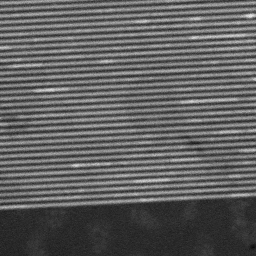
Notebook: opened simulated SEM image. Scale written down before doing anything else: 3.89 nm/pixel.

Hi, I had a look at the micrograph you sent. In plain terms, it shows parallel lines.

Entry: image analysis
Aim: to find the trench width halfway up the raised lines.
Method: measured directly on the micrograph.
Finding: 16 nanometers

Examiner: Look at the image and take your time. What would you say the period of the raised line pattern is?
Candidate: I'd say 6.38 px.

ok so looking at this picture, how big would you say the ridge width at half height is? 0.0063 µm